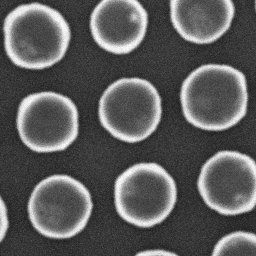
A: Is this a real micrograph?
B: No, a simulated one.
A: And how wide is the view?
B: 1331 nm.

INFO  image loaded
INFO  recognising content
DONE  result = raised bodies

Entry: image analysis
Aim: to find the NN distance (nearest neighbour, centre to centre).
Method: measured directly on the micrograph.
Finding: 442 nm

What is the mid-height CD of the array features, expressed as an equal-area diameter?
0.32 µm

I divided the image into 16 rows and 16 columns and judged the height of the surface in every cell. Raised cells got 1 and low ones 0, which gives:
0110001110011100
1111001110011100
1111001110001000
0111000000000000
0000000000001110
0000000111011110
0011001111011110
0111101111001110
0111100110000000
0000000000000000
0000000011000111
0011100111100111
0011110111100111
0011100011000000
0001100000000000
0000000000000011